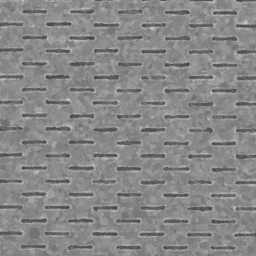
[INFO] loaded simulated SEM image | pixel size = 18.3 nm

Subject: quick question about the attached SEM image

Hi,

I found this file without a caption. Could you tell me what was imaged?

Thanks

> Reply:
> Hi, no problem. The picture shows a regular array of holes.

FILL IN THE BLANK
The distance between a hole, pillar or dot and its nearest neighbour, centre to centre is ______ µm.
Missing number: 0.473